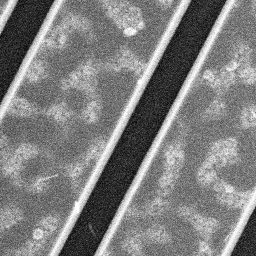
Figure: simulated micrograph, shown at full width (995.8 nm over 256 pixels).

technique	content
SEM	one or a few lines or trenches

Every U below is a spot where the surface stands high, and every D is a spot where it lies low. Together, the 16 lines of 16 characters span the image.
UDDUUUUUUUUDDDUU
DDDUUUUUUUUDDDUU
DDUUUUUUUUDDDUUU
DDUUUUUUUUDDDUUU
DUUUUUUUUDDDUUUU
DUUUUUUUUDDDUUUU
UUUUUUUUDDDUUUUU
UUUUUUUUDDUUUUUU
UUUUUUUDDDUUUUUU
UUUUUUUDDUUUUUUU
UUUUUUDDDUUUUUUU
UUUUUUDDUUUUUUUU
UUUUUDDDUUUUUUUU
UUUUUDDUUUUUUUUD
UUUUDDDUUUUUUUUD
UUUUDDUUUUUUUUDD